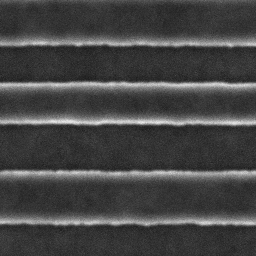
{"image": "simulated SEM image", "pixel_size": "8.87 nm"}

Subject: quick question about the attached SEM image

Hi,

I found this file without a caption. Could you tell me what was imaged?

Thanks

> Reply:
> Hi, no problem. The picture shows lines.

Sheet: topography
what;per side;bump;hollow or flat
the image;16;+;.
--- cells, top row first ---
++++++++++++++++
++++++++++++++++
++++++++++++++++
................
................
++++++++++++++++
++++++++++++++++
++++++++++++++++
................
................
................
++++++++++++++++
++++++++++++++++
++++++++++++++++
................
................